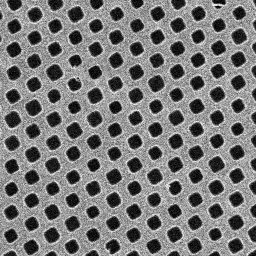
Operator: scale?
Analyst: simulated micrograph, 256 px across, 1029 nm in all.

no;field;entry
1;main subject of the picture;a regular array of holes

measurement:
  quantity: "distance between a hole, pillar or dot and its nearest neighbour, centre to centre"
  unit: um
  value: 0.0926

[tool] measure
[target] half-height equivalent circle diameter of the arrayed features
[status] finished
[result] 55.2 nanometers